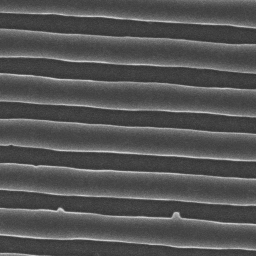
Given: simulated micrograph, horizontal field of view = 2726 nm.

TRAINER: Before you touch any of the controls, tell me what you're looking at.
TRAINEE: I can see parallel lines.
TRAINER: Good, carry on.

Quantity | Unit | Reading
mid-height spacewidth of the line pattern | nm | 184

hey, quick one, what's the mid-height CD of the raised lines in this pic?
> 26.8 pixels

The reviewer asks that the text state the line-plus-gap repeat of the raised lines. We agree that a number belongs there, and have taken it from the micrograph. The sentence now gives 0.475 µm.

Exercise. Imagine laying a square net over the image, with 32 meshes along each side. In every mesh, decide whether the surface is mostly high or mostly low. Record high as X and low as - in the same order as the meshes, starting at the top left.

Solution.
XXXXXXXXXXXXXXXXXXXXXXXXXXXXXXXX
XXXXXXXXXXXXXXXXXXXXXXXXXXXXXXXX
-----------------XXXXXXXXXXXXXXX
--------------------------------
XXXXXXXXXXXXX-------------------
XXXXXXXXXXXXXXXXXXXXXXXXXXXX----
XXXXXXXXXXXXXXXXXXXXXXXXXXXXXXXX
--------XXXXXXXXXXXXXXXXXXXXXXXX
-------------------------XXXXXXX
XXXX----------------------------
XXXXXXXXXXXXXXXXXXXXX-----------
XXXXXXXXXXXXXXXXXXXXXXXXXXXXXXXX
XXXXXXXXXXXXXXXXXXXXXXXXXXXXXXXX
-------------XXXXXXXXXXXXXXXXXXX
-------------------------------X
XXXXXXXXXXX---------------------
XXXXXXXXXXXXXXXXXXXXXXXXXXX-----
XXXXXXXXXXXXXXXXXXXXXXXXXXXXXXXX
-----XXXXXXXXXXXXXXXXXXXXXXXXXXX
-----------------------XXXXXXXXX
XX------------------------------
XXXXXXXXXXXXXXX-X---------------
XXXXXXXXXXXXXXXXXXXXXXXXXXXXXXXX
XXXXXXXXXXXXXXXXXXXXXXXXXXXXXXXX
-----------XXXXXXXXXXXXXXXXXXXXX
---------------------------X-XXX
XXXXXXXX------------------------
XXXXXXXXXXXXXXXXXXXXXXXXX-------
XXXXXXXXXXXXXXXXXXXXXXXXXXXXXXXX
--XXXXXXXXXXXXXXXXXXXXXXXXXXXXXX
-------------------XXXXXXXXXXXXX
--------------------------------